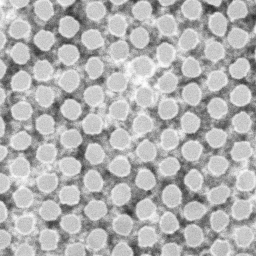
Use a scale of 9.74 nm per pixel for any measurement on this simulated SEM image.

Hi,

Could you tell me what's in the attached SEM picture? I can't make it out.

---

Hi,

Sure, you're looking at a regular array of raised bodies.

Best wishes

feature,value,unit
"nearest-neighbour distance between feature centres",256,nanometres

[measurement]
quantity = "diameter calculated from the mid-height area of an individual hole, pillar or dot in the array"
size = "190 nm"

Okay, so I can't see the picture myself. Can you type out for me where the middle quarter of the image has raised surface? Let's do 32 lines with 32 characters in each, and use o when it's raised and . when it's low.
......oooo.......oooooo.......oo
......oooo.......oooooo.......oo
ooo...ooo...ooo...oooo...oo...oo
oooo...o...oooo.........oooo....
oooo.......ooooo........oooo....
ooo........oooo........ooooo...o
oo....ooo...ooo...oooo..ooo...oo
.....ooooo........oooo........oo
.....ooooo........oooo........oo
ooo...ooo....oo...oooo...ooo...o
oooo........oooo...oo...oooo....
oooo.......ooooo........oooo....
oooo.......ooooo........oooo..oo
.oo..oooo....oo...ooo....o...ooo
.....ooooo........oooo.......ooo
.....oooo........ooooo........oo
..o..oooo....oo...oooo...oo...oo
oooo........oooo.........ooo....
oooo........oooo........ooooo...
oooo........oooo....o...ooooo..o
ooo...ooo...oooo...ooo..oooo..oo
......oooo........ooooo.......oo
..o..ooooo........ooooo.......oo
.o....oooo.........oooo...o...oo
oooo...oo...oooo.........oooo...
oooo.......ooooo........ooooo...
oooo.......ooooo........oooo....
ooo...ooo....ooo...ooo...ooo...o
.....oooo.........ooooo.......oo
.....ooooo........ooooo.......oo
......ooo....ooo...ooo....oo...o
ooo...ooo...ooooo........oooo...